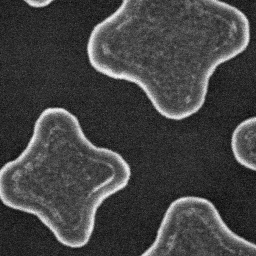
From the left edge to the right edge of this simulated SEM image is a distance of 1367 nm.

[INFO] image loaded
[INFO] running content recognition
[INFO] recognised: raised bodies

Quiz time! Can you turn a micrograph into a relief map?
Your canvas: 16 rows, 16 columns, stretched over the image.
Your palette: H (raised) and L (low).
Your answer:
LLLLLLLLHHHHHHHL
LLLLLLHHHHHHHHHL
LLLLLLHHHHHHHHHL
LLLLLLHHHHHHHHLL
LLLLLLLHHHHHHLLL
LLLLLLLLLHHHHLLL
LLLLLLLLLLHHHLLL
LLHHHLLLLLLLLLLL
LLHHHLLLLLLLLLLH
LLHHHHHLLLLLLLLH
HHHHHHHHLLLLLLLL
HHHHHHHHLLLLLLLL
HHHHHHLLLLLHHLLL
LLHHHHLLLLHHHHLL
LLLHHHLLLLHHHHLL
LLLLLLLLLHHHHHHH